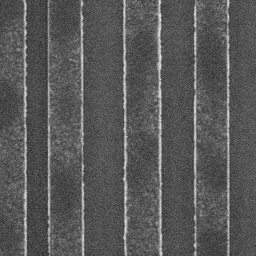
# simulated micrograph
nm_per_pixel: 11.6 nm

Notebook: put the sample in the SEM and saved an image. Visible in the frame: lines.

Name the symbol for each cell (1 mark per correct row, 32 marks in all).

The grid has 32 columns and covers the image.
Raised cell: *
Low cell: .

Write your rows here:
***...****......****....*****...
***...****......****....****....
***...****......****....*****...
***...****......****....****....
***...****......****....*****...
***...****......****....*****...
***...****......****....*****...
***...****......****....*****...
***...****......****....*****...
***...****......****....*****...
***...****......****....*****...
***...****......****....*****...
***...****......****....*****...
***...****......****....*****...
***...****......****....*****...
***...****......****....*****...
***...****......****....*****...
***...****......****....*****...
***...****......****....*****...
***...****......****....*****...
***...****......****....*****...
***...****......****....*****...
***...****......****....*****...
***...****......****....*****...
***...****......****....*****...
***...****......****....*****...
***...****......****....*****...
***...****......****....*****...
***...****......****....*****...
***...****......****....*****...
***...****......****....*****...
***...****......****....*****...